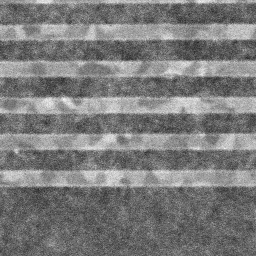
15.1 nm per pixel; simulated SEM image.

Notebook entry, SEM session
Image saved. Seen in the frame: parallel lines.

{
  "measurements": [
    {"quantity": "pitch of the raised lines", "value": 551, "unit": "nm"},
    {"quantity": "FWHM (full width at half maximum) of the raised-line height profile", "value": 209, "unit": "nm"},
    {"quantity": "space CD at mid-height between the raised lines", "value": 341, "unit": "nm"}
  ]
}